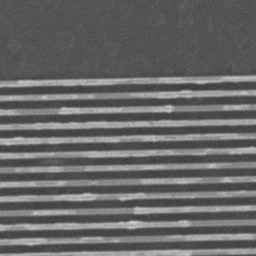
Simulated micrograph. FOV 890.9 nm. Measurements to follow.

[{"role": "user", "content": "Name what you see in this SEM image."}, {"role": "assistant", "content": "parallel lines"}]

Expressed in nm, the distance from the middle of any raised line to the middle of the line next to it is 50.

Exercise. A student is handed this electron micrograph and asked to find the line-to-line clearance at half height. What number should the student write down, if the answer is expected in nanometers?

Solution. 31.8